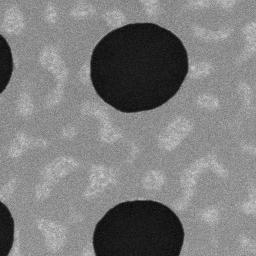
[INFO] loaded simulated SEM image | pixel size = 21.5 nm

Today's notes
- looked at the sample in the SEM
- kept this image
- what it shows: holes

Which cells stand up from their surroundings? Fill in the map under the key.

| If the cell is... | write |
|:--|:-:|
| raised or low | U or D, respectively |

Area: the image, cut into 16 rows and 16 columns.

UUUUUUUUUUUUUUUU
UUUUUUUUDDUUUUUU
UUUUUUDDDDDUUUUU
DUUUUUDDDDDDUUUU
DUUUUUDDDDDDUUUU
UUUUUUDDDDDUUUUU
UUUUUUUDDDUUUUUU
UUUUUUUUUUUUUUUU
UUUUUUUUUUUUUUUU
UUUUUUUUUUUUUUUU
UUUUUUUUUUUUUUUU
UUUUUUUUUUUUUUUU
UUUUUUUUUUUUUUUU
DUUUUUDDDDDUUUUU
DUUUUUDDDDDDUUUU
DUUUUUDDDDDUUUUU